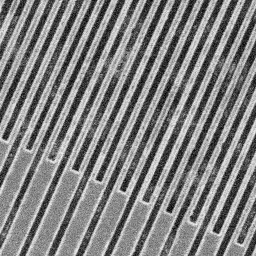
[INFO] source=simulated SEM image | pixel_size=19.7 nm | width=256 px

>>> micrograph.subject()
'parallel lines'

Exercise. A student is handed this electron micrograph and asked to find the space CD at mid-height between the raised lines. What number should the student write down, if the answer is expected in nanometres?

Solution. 173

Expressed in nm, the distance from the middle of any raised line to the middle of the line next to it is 253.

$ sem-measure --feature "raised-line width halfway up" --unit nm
85.6